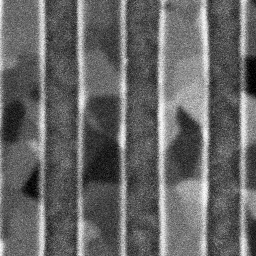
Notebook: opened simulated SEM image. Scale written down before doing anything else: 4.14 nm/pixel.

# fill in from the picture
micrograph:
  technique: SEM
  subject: one or a few lines or trenches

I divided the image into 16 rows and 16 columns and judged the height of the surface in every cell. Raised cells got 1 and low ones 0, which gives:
1110011100111001
1110011100111001
1110011100111001
1110011100111001
1110011100111001
1110011100111001
1110011100111001
1110011100111001
1110011100111001
1110011100111001
1110011100111001
1110011100111001
1110011100111001
1110011100111001
1110011100111001
1110011100111001